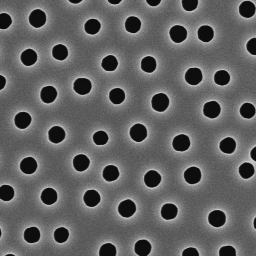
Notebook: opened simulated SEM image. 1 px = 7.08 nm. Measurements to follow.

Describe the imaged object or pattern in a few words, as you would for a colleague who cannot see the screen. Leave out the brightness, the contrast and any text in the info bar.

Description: a regular array of holes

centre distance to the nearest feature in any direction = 242 nm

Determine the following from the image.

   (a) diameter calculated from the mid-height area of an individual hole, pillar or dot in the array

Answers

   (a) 118 nm